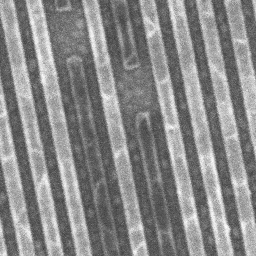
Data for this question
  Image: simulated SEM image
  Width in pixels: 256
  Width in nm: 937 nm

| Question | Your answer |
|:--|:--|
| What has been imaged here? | parallel lines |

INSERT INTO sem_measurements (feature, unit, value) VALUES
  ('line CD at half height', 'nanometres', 52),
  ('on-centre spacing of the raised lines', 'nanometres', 102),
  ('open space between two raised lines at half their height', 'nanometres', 49.3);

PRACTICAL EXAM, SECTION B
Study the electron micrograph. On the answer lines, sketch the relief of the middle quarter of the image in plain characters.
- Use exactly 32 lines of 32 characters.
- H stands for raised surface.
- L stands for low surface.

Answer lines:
LHHHHLLLHHHHLLLHHHLLLLHHHHLLLHHH
LHHHHLLLHHHHLLLLLLLLLLHHHHLLLHHH
LHHHHLLLHHHHLLLLLLLLLLLHHHLLLLHH
LLHHHLLLLHHHLLLLLLLLLLLHHHLLLLHH
LLHHHLLLLHHHLLLLLLLLLLLHHHLLLLHH
LLHHHLLLLHHHHLLLLLLLLLLHHHHLLLHH
LLHHHHLLLHHHHLLLLLLLLLLHHHHLLLHH
LLHHHHLLLHHHHLLLLLLLLLLLHHHLLLLH
LLLHHHLLLLHHHLLLLLLLLLLLHHHLLLLH
LLLHHHLLLLHHHLLLLLLLLLLLHHHLLLLH
LLLHHHLLLLHHHHLLLLLLLLLLHHHHLLLH
LLLHHHHLLLHHHHLLLLLLLLLLHHHHLLLH
LLLHHHHLLLHHHHLLLLLHHLLLLHHHLLLL
LLLLHHHLLLLHHHLLLLHHHLLLLHHHLLLL
LLLLHHHLLLLHHHLLLLHHLLLLLHHHLLLL
LLLLHHHLLLLHHHHLLLHHHHLLLHHHHLLL
HLLLHHHHLLLHHHHLLLHHHHLLLLHHHLLL
HLLLHHHHLLLHHHHLLLHHHHLLLLHHHLLL
HLLLLHHHLLLLHHHLLLLHHHLLLLHHHLLL
HLLLLHHHLLLLHHHLLLLHHHLLLLHHHLLL
HLLLLHHHLLLLHHHHLLLHHHHLLLHHHHLL
HHLLLHHHHLLLHHHHLLLHHHHLLLHHHHLL
HHLLLHHHHLLLHHHHLLLHHHHLLLLHHHLL
HHLLLLHHHLLLLHHHLLLLHHHLLLLHHHLL
HHLLLLHHHLLLLHHHLLLLHHHLLLLHHHLL
HHLLLLHHHLLLLHHHHLLLHHHHLLLHHHHL
HHHLLLHHHHLLLHHHHLLLHHHHLLLHHHHL
HHHLLLHHHHLLLHHHHLLLHHHHLLLLHHHL
HHHLLLLHHHLLLLHHHLLLLHHHLLLLHHHL
HHHLLLLHHHLLLLHHHLLLLHHHLLLLHHHL
HHHLLLLHHHLLLLHHHHLLLHHHHLLLHHHH
HHHHLLLHHHHLLLHHHHLLLHHHHLLLHHHH